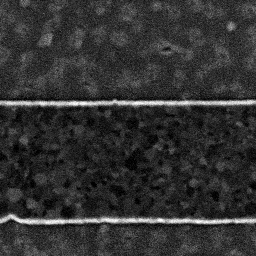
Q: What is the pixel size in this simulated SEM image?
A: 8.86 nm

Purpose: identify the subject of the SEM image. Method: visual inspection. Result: one or a few lines or trenches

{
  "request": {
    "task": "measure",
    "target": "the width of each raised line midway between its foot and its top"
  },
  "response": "1.05 microns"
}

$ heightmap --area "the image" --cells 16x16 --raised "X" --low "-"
----------------
----------------
----------------
----------------
----------------
----------------
X-XXXXXXXXXXXXXX
XXXXXXXXXXXXXXXX
XXXXXXXXXXXXXXXX
XXXXXXXXXXXXXXXX
XXXXXXXXXXXXXXXX
XXXXXXXXXXXXXXXX
XXXXXXXXXXXXXXXX
XXXXXXXXXXXXXXXX
----------------
----------------